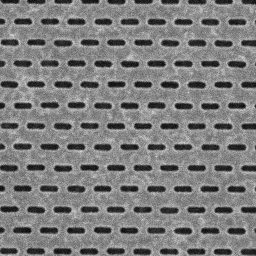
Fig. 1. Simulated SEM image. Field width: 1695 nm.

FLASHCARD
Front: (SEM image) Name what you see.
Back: a regular array of holes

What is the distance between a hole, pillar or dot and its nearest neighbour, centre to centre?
162 nm